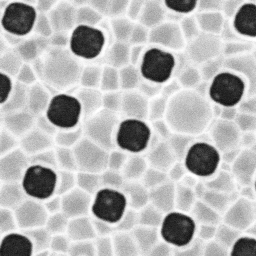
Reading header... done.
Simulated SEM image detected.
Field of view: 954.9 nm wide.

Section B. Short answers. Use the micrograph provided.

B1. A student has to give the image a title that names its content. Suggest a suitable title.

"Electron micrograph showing a regular array of holes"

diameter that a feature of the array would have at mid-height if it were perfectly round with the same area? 132 nm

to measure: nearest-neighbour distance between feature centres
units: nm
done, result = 273